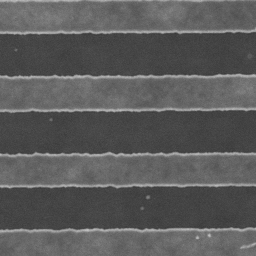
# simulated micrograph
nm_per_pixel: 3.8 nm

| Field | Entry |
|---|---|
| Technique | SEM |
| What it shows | lines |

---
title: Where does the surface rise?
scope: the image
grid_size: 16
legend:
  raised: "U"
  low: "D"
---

UUUUUUUUUUUUUUUU
UUUUUUUUUUUUUUUU
DDDDDDDDDDDDDDDD
DDDDDDDDDDDDDDDD
DDDDDDDDDDDDDDDD
UUUUUUUUUUUUUUUU
UUUUUUUUUUUUUUUU
DDDDDDDDDDDDDDDD
DDDDDDDDDDDDDDDD
DDDDDDDDDDDDDDDD
UUUUUUUUUUUUUUUU
UUUUUUUUUUUUUUUU
DDDDDDDDDDDDDDDD
DDDDDDDDDDDDDDDD
UUUUUUUUUUUUUUUU
UUUUUUUUUUUUUUUU